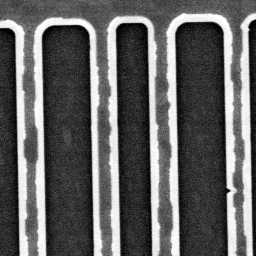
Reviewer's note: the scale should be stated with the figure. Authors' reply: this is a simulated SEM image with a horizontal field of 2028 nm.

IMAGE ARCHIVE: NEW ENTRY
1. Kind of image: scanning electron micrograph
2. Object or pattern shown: one or a few lines or trenches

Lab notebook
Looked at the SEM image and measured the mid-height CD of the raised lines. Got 166 nm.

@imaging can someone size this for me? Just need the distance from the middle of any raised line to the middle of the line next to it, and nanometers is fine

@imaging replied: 548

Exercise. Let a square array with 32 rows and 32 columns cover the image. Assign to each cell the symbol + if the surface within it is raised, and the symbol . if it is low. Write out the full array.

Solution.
++++++++++++++++++++++++++++++++
++++++++++++++++++++++++++++++++
+++++++++++++++..++++++....++++.
..+++......+++.....+++......+++.
..+++.......++.....+++......+++.
..+++.......++.....+++......+++.
..+++.......++.....+++......+++.
..+++.......++.....+++......+++.
..+++.......++.....+++......+++.
..+++.......++.....+++......+++.
..+++.......++.....+++......+++.
..+++.......++.....+++......+++.
..+++.......++.....+++.......++.
..+++.......++.....+++.......++.
..+++.......++.....+++.......++.
...++.......++.....+++.......++.
...++.......++.....+++.......++.
...++.......++.....+++.......++.
...++.......++.....+++.......++.
...++.......++.....+++.......++.
...++.......++.....+++.......++.
...++.......++.....+++.......++.
...++.......++.....+++.......++.
...++.......++.....+++.......++.
...++.......++.....+++.......++.
...++.......++.....+++.......++.
...++.......+++....+++.......++.
...++.......+++....+++.......++.
...++.......+++....+++.......++.
...++.......+++....+++.......++.
...++.......+++....+++.......++.
...++.......+++....+++.......++.